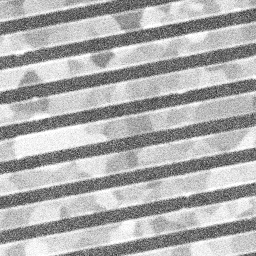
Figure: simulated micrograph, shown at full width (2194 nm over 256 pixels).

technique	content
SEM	parallel lines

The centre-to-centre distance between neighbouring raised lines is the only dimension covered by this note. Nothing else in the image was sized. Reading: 34.2 px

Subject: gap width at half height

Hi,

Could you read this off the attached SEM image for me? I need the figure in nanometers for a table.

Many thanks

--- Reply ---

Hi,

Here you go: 132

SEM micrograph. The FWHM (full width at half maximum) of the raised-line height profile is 0.165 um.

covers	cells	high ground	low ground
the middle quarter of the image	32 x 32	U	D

UUUUUUUUUUUUUUUUDDDDDDDDDDDDDDDD
UUUUUUUUUUUDDDDDDDDDDDDDDDDDDDDU
UUUUUUDDDDDDDDDDDDDDDDDDDDDUUUUU
UDDDDDDDDDDDDDDDDDDDDUUUUUUUUUUU
DDDDDDDDDDDDDDDUUUUUUUUUUUUUUUUU
DDDDDDDDDDUUUUUUUUUUUUUUUUUUUUUU
DDDDDDUUUUUUUUUUUUUUUUUUUUUUUUUD
UUUUUUUUUUUUUUUUUUUUUUUUUUDDDDDD
UUUUUUUUUUUUUUUUUUUUUDDDDDDDDDDD
UUUUUUUUUUUUUUDDDDDDDDDDDDDDDDDD
UUUUUUUUUDDDDDDDDDDDDDDDDDDDDDUU
UUUUDDDDDDDDDDDDDDDDDDDDDUUUUUUU
DDDDDDDDDDDDDDDDDDDDUUUUUUUUUUUU
DDDDDDDDDDDDDDUUUUUUUUUUUUUUUUUU
DDDDDDDDDUUUUUUUUUUUUUUUUUUUUUUU
DDDDUUUUUUUUUUUUUUUUUUUUUUUUUDDD
UUUUUUUUUUUUUUUUUUUUUUUUDDDDDDDD
UUUUUUUUUUUUUUUUUUUDDDDDDDDDDDDD
UUUUUUUUUUUUUDDDDDDDDDDDDDDDDDDD
UUUUUUUUDDDDDDDDDDDDDDDDDDDDUUUU
UUUDDDDDDDDDDDDDDDDDDDDUUUUUUUUU
DDDDDDDDDDDDDDDDDDUUUUUUUUUUUUUU
DDDDDDDDDDDDUUUUUUUUUUUUUUUUUUUU
DDDDDDDUUUUUUUUUUUUUUUUUUUUUUUUU
DDUUUUUUUUUUUUUUUUUUUUUUUUUDDDDD
UUUUUUUUUUUUUUUUUUUUUUDDDDDDDDDD
UUUUUUUUUUUUUUUUUDDDDDDDDDDDDDDD
UUUUUUUUUUUDDDDDDDDDDDDDDDDDDDDD
UUUUUUDDDDDDDDDDDDDDDDDDDDDUUUUU
UDDDDDDDDDDDDDDDDDDDDDUUUUUUUUUU
DDDDDDDDDDDDDDDDDUUUUUUUUUUUUUUU
DDDDDDDDDDDDUUUUUUUUUUUUUUUUUUUU